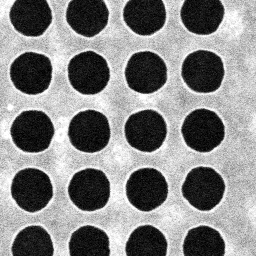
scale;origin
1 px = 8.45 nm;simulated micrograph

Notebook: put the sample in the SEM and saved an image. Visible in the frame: a regular array of holes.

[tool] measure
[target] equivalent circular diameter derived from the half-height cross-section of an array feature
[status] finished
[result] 43.4 pixels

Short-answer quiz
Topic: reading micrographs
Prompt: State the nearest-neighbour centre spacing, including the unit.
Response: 482 nanometers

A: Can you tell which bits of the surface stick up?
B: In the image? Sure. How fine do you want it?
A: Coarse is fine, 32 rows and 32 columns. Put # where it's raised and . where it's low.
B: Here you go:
##....###....###.....##.....####
#.....##......#......#......####
#......#......##.....##.....####
##....###....###....###....#####
###..#####..####################
################################
##########..#####..#####..######
##....###....###....###.....####
#......#......##.....##.....####
#......#......##.....##.....####
##....###....###.....##.....####
###..#####...####..######..#####
################################
################################
##....###....###....###....#####
#......##.....##.....##.....####
#......#......##.....##.....####
##....###.....##.....##.....####
##....###....####...####...#####
################################
################################
##...#####...####...####...#####
##....###.....##.....##.....####
#......#......##.....##.....####
#......##.....##.....##.....####
##....###....###....####...#####
###.############################
################################
###..#####..#####...####...#####
##....###....###.....##.....####
##.....##.....##.....##.....####
#......##.....##.....##.....####